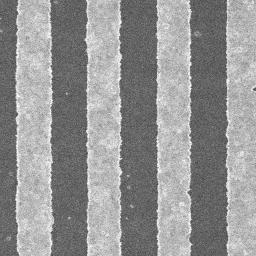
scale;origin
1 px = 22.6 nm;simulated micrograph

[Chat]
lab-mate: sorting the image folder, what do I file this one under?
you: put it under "one or a few lines or trenches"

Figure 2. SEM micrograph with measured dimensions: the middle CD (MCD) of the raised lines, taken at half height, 739 nanometres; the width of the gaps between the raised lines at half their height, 0.84 µm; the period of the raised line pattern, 1580 nm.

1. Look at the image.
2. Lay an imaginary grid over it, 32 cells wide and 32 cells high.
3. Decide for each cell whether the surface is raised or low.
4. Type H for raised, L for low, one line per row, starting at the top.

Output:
LLHHHHLLLLLHHHHLLLLLHHHHLLLLHHHH
LLHHHHLLLLLHHHHLLLLLHHHHLLLLHHHH
LLHHHHLLLLLHHHHLLLLLHHHHLLLLHHHH
LLHHHHLLLLLHHHHLLLLLHHHHLLLLHHHH
LLHHHHLLLLLHHHHLLLLLHHHHLLLLHHHH
LLHHHHLLLLLHHHHLLLLLHHHHLLLLHHHH
LLHHHHLLLLLHHHHLLLLLHHHHLLLLHHHH
LLHHHHLLLLLHHHHLLLLLHHHHLLLLHHHH
LLHHHHLLLLLHHHHLLLLLHHHHLLLLHHHH
LLHHHHLLLLLHHHHLLLLLHHHHLLLLHHHH
LLHHHHLLLLLHHHHLLLLLHHHHLLLLHHHH
LLHHHHLLLLLHHHHLLLLLHHHHLLLLHHHH
LLHHHHLLLLLHHHHLLLLLHHHHLLLLHHHH
LLHHHHLLLLLHHHHLLLLLHHHHLLLLHHHH
LLHHHHLLLLLHHHHLLLLLHHHHLLLLHHHH
LLHHHHLLLLLHHHHLLLLLHHHHLLLLHHHH
LLHHHHLLLLLHHHHLLLLLHHHHLLLLHHHH
LLHHHHLLLLLHHHHLLLLLHHHHLLLLHHHH
LLHHHHLLLLLHHHHLLLLLHHHHLLLLHHHH
LLHHHHLLLLLHHHHLLLLLHHHHLLLLHHHH
LLHHHHLLLLLHHHHLLLLLHHHHLLLLHHHH
LLHHHHLLLLLHHHHLLLLLHHHHLLLLHHHH
LLHHHHLLLLLHHHHLLLLLHHHHLLLLHHHH
LLHHHHLLLLLHHHHLLLLLHHHHLLLLHHHH
LLHHHHLLLLLHHHHLLLLLHHHHLLLLHHHH
LLHHHHLLLLLHHHHLLLLLHHHHLLLLHHHH
LLHHHHLLLLLHHHHLLLLLHHHHLLLLHHHH
LLHHHHHLLLLHHHHLLLLLHHHHLLLLHHHH
LLHHHHLLLLLHHHHLLLLLHHHHLLLLLHHH
LLHHHHLLLLLHHHHLLLLLHHHHLLLLLHHH
LLHHHHLLLLLHHHHLLLLLHHHHLLLLLHHH
LLHHHHLLLLLHHHHLLLLLHHHHLLLLLHHH